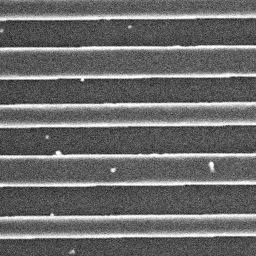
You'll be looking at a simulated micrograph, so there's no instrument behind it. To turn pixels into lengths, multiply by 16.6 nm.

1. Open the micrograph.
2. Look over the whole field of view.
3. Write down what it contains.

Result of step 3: lines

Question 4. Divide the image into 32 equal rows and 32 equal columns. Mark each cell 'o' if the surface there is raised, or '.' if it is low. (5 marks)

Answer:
oooooooooooooooooooooooooooooooo
oooooooooooooooooooooooooooooooo
................................
................................
................................
................................
oooooooooooooooooooooooooooooooo
oooooooooooooooooooooooooooooooo
oooooooooooooooooooooooooooooooo
oooooooooooooooooooooooooooo....
................................
................................
................................
oooooooooooooooooooooooooooooooo
oooooooooooooooooooooooooooooooo
oooooooooooooooooooooooooooooooo
................................
................................
................................
.......ooooooooooooooooooooooooo
oooooooooooooooooooooooooooooooo
oooooooooooooooooooooooooooooooo
oooooooooooooooooooooooooooooooo
................................
................................
................................
................................
oooooooooooooooooooooooooooooooo
oooooooooooooooooooooooooooooooo
oooooooooooooooooooooooo........
................................
................................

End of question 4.